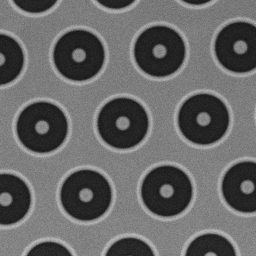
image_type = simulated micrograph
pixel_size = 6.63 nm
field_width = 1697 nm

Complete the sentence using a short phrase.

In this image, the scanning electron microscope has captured an array of small figures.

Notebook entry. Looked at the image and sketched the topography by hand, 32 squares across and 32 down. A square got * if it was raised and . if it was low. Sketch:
**.....*****.....******...******
***...**************************
********************************
******************....******....
.*******....*****......****.....
...****......****......****.....
...***.......****......****.....
...****......****......****.....
...****......****......*****....
..******....*******..***********
.*******************************
*************************.******
**************...******.....****
***.....*****.....****.......***
**......****.......***.......***
**.......***.......***.......***
**.......***.......***......****
**......*****.....*****.....****
***....*******...***************
********************************
*****************************...
.********....*****.....*****....
...*****......****......****....
....***.......****......****....
....***.......****......****....
....****......****......****....
....****.....******....*******..
...******...********************
********************************
*************************...****
****....******.....*****.....***
***......****......****.......**